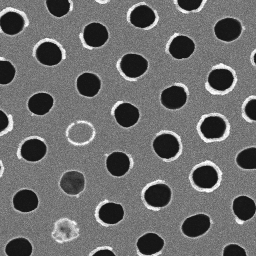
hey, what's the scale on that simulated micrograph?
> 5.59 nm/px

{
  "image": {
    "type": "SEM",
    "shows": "a regular array of holes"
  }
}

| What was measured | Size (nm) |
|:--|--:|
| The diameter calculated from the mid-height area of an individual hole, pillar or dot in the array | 134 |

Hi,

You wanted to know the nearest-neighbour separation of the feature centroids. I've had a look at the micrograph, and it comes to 273 nm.